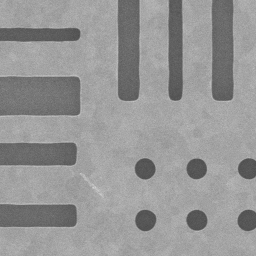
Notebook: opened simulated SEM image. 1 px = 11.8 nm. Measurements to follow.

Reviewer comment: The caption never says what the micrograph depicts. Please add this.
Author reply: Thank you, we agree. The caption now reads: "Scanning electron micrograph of groups of lines, slits or small figures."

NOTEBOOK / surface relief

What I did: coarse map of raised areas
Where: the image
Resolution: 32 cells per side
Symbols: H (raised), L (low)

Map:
HHHHHHHHHHHHHHHLLLHHHLLHHHLLLHHH
HHHHHHHHHHHHHHHLLLHHHLLHHHLLLHHH
HHHHHHHHHHHHHHHLLLHHHLLHHHLLLHHH
LLLLLLLLLHHHHHHLLLHHHLLHHHLLLHHH
LLLLLLLLLLHHHHHLLLHHHLLHHHLLLHHH
HHHHHHHHHHHHHHHLLLHHHLLHHHLLLHHH
HHHHHHHHHHHHHHHLLLHHHLLHHHLLLHHH
HHHHHHHHHHHHHHHLLLHHHLLHHHLLLHHH
HHHHHHHHHHHHHHHLLLHHHLLHHHLLLHHH
LLLLLLLLLHHHHHHLLLHHHLLHHHLLLHHH
LLLLLLLLLLHHHHHLLLHHHLLHHHLLLHHH
LLLLLLLLLLHHHHHLLHHHHLLHHHLLLHHH
LLLLLLLLLLHHHHHLLHHHHHHHHHHLLHHH
LLLLLLLLLLHHHHHHHHHHHHHHHHHHHHHH
LLHHLLLHHHHHHHHHHHHHHHHHHHHHHHHH
HHHHHHHHHHHHHHHHHHHHHHHHHHHHHHHH
HHHHHHHHHHHHHHHHHHHHHHHHHHHHHHHH
HHHHHHHHHHHHHHHHHHHHHHHHHHHHHHHH
LLLLLLLLLLHHHHHHHHHHHHHHHHHHHHHH
LLLLLLLLLLHHHHHHHHHHHHHHHHHHHHHH
LLLLLLLLLHHHHHHHHLLHHHHLLLHHHHLL
HHHHHHHHHHHHHHHHHLLHHHHLLLHHHHLL
HHHHHHHHHHHHHHHHHHHHHHHHHHHHHHHH
HHHHHHHHHHHHHHHHHHHHHHHHHHHHHHHH
HHHHHHHHHHHHHHHHHHHHHHHHHHHHHHHH
LLLLLLLLLHHHHHHHHHHHHHHHHHHHHHHH
LLLLLLLLLLHHHHHHHLLHHHHHLHHHHHLL
LLLLLLLLLLHHHHHHHLLLHHHLLLHHHHLL
HHHHHHHHHHHHHHHHHLLHHHHHLHHHHHLL
HHHHHHHHHHHHHHHHHHHHHHHHHHHHHHHH
HHHHHHHHHHHHHHHHHHHHHHHHHHHHHHHH
HHHHHHHHHHHHHHHHHHHHHHHHHHHHHHHH